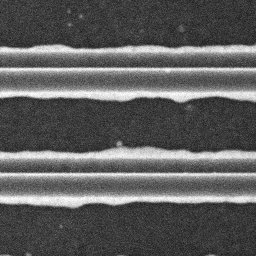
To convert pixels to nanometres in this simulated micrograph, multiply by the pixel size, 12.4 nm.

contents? lines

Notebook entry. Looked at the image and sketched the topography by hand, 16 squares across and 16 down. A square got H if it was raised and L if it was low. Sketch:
LLLLLLLLLLLLLLLL
LLLLLLLLLLLLLLLL
LLLLLLLLLLLLLLLL
HHHHHHHHHHHHHHHH
HHHHHHHHHHHHHHHH
HHHHHHHHHHHHHHHH
LLLLLLLLLLLLLLLL
LLLLLLLLLLLLLLLL
LLLLLLLLLLLLLLLL
LLLLLLLLLLLLLLLL
HHHHHHHHHHHHHHHH
HHHHHHHHHHHHHHHH
HHHHHHHHLLLLLLLL
LLLLLLLLLLLLLLLL
LLLLLLLLLLLLLLLL
LLLLLLLLLLLLLLLL